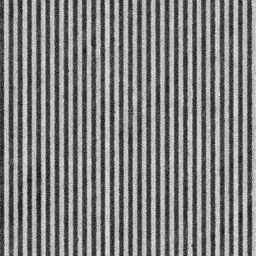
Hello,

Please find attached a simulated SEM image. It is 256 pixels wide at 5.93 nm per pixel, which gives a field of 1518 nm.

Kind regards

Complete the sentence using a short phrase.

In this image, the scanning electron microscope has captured parallel lines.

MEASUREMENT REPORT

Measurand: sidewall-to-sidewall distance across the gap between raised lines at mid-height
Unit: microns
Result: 0.0371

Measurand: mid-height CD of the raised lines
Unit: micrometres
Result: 0.0208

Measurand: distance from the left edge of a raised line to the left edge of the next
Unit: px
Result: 9.19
